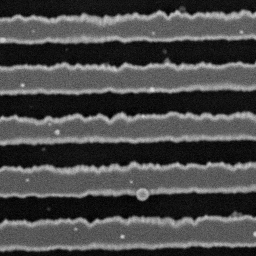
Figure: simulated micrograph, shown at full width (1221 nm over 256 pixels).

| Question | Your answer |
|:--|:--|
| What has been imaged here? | lines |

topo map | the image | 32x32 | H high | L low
LLLLLLLLLLLLLLLLLLLLLLLLLLLLLLLL
LLLLLLLLLLLLLLLLLLLHLLHLLLLHLHHL
HHHHHHHHHHHHHHHHHHHHHHHHHHHHHHHH
HHHHHHHHHHHHHHHHHHHHHHHHHHHHHHHH
HHHHHHHHHHHHHHHHHHHHHHHHHHHHHHHH
LLLHLLLLLLLLLLLLLLLLLLLLLLLLLLLL
LLLLLLLLLLLLLLLLLLLLLLLLLLLLLLLL
LLLLLLLLLLLLLLLLLLLLLLLLLLLLLLLL
HHHHHHHHHHHHHHHHHHHHHHHHHHHHHHHH
HHHHHHHHHHHHHHHHHHHHHHHHHHHHHHHH
HHHHHHHHHHHHHHHHHHHHHHHHHHHHHHHH
HHHHHHHHHHHHHLHHHHHHHHLLLLLLLLLL
LLLLLLLLLLLLLLLLLLLLLLLLLLLLLLLL
LLLLLLLLLLLLLLLLLLLLLLLLLLLLLLLL
LLLLLLLLHHLLHLHHLHHHHHHHHHHHHHHH
HHHHHHHHHHHHHHHHHHHHHHHHHHHHHHHH
HHHHHHHHHHHHHHHHHHHHHHHHHHHHHHHH
HHHHHHHHHHHHHHHHHHHHHHHHHLHHHHLH
LLLLLLLLLLLLLLLLLLLLLLLLLLLLLLLL
LLLLLLLLLLLLLLLLLLLLLLLLLLLLLLLL
LLLLLLLLLLLLLLLLHLHLLHHLHLHHLLHH
HHHHHHHHHHHHHHHHHHHHHHHHHHHHHHHH
HHHHHHHHHHHHHHHHHHHHHHHHHHHHHHHH
HHHHHHHHHHHHHHHHHHHHHHHHHHHHHHHH
HHHHHHHHHHHLLLLLLHHLLLLLLLLLLLLL
LLLLLLLLLLLLLLLLLLLLLLLLLLLLLLLL
LLLLLLLLLLLLLLLLLLLLLLLLLLLLLLLL
LLLLLHHHHHHLHHHHHHHHHHHHHHHHHHHH
HHHHHHHHHHHHHHHHHHHHHHHHHHHHHHHH
HHHHHHHHHHHHHHHHHHHHHHHHHHHHHHHH
HHHHHHHHHHHHHHHHHHHHHHHHHHHHHHHH
LLLLLLLLLLLLLLLLLLLLLLLLLLLLLLLL